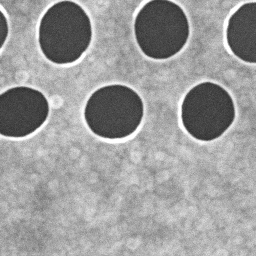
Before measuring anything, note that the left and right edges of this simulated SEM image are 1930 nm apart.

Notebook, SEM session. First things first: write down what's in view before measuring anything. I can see holes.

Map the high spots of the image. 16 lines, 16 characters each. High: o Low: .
ooo..oooo..oooo.
oo....oo....oo..
oo....ooo...oo..
ooo..oooo..oooo.
oooooooooooooooo
o.oooo..oooo..oo
...oo....oo....o
...oo....oo....o
..oooo..oooo..oo
oooooooooooooooo
oooooooooooooooo
oooooooooooooooo
oooooooooooooooo
oooooooooooooooo
oooooooooooooooo
oooooooooooooooo